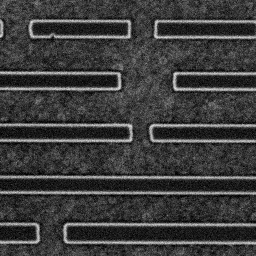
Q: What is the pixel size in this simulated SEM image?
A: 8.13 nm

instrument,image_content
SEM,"parallel lines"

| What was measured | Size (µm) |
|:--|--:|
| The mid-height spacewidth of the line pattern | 0.287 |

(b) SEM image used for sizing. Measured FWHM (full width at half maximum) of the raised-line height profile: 136 nm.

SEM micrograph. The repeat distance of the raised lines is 414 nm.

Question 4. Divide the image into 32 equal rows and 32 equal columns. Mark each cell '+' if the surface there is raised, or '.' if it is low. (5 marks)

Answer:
................................
................................
................................
....++++++++++++...+++++++++++++
....++++++++++++....++++++++++++
................................
................................
................................
................................
+++++++++++++++.......++++++++++
+++++++++++++++.......++++++++++
................................
................................
................................
................................
................................
++++++++++++++++...+++++++++++++
++++++++++++++++...+++++++++++++
................................
................................
................................
................................
++++++++++++++++++++++++++++++++
++++++++++++++++++++++++++++++++
................................
................................
................................
................................
+++++...++++++++++++++++++++++++
+++++...++++++++++++++++++++++++
................................
................................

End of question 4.